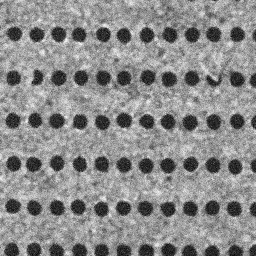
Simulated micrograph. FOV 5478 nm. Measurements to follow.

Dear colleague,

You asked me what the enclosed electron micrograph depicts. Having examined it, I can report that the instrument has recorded a regular array of holes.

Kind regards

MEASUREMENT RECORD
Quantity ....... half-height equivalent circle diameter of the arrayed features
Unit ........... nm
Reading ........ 350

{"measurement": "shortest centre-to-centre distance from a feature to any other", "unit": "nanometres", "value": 467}